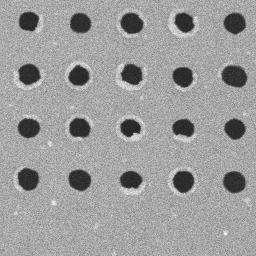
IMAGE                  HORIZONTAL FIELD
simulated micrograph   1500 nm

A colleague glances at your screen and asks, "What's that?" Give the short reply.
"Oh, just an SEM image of a regular array of holes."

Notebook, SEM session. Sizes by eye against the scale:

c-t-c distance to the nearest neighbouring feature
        298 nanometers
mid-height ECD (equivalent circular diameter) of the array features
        120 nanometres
